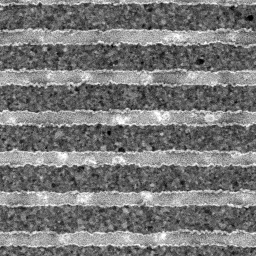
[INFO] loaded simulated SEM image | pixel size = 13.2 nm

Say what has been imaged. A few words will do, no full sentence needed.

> parallel lines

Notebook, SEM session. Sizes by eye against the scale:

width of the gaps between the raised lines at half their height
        0.165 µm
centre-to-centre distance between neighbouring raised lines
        531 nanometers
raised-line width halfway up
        365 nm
